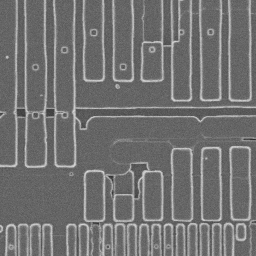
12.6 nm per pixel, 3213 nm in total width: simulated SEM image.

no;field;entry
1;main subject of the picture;wiring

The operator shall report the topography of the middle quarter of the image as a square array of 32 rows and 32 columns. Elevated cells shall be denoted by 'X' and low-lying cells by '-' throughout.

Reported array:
XXX--XXXXX--XX-XX--XXXXXX--XXXXX
XX---XXXXX--XXXXX--XXXXXX--XXXXX
XX---XXXXX--XXXXX--XXXXXX--XXXXX
XXX--XXXXX--XXXXX--XXXXXX--XXXXX
XXX------------------------XXXXX
XXX------------------------XXXXX
XXX------------------------XXXXX
XXX------------------------XXXXX
XXX------------------------XXXXX
XXX-----------------------------
XXX-----------------------------
XX------------------------------
XX------------------------------
XXX-----------------------------
XXX-----------------------------
XXX-----------------------------
XXX-----------------------------
XXX-----------------------------
XXX-----------------------------
XXX-----------------------------
XXX-----------------------------
XXX------------------------XXXXX
XXX------------------------XXXXX
XXX------------------------XXXXX
XXX------------------------XXXXX
XXX------------------------XXXXX
---------------------------XXXXX
-----XXXXX----------XXXXX--XXXXX
-----XXXXX----------XXXXX--XXXXX
-----XXXXX----------XXXXX--XXXXX
-----XXXXX----------XXXXX--XXXXX
-----XXXXX----------XXXXX--XXXXX